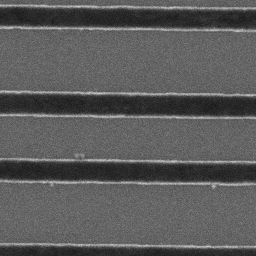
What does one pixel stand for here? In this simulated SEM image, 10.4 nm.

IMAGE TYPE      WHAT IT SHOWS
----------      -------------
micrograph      lines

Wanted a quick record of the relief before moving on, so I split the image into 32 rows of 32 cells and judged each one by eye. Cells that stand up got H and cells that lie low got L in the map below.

LLLLLLLLLLLLLLLLLLLLLLLLLLLLLLLL
HHHHHHHHHHHHHHHHHHHHHHHHHHHHHHHH
HHHHHHHHHHHHHHHHHHHHHHHHHHHHHHHH
LLLHHHHHHHHHHHHHHHHHHHHHHHHHHHHH
LLLLLLLLLLLLLLLLLLLLLLLLLLLLLLLL
LLLLLLLLLLLLLLLLLLLLLLLLLLLLLLLL
LLLLLLLLLLLLLLLLLLLLLLLLLLLLLLLL
LLLLLLLLLLLLLLLLLLLLLLLLLLLLLLLL
LLLLLLLLLLLLLLLLLLLLLLLLLLLLLLLL
LLLLLLLLLLLLLLLLLLLLLLLLLLLLLLLL
LLLLLLLLLLLLLLLLLLLLLLLLLLLLLLLL
LLLLLLLLLLLLLLLLLLLLLLLLLLLLLLLL
HHHHHHHHHHHHHHHHHHHHHHHHHHHHHHHH
HHHHHHHHHHHHHHHHHHHHHHHHHHHHHHHH
LLLLLLHHHHHHHHHHHHHHHHHHHHHHHHHH
LLLLLLLLLLLLLLLLLLLLLLLLLLLLLLLL
LLLLLLLLLLLLLLLLLLLLLLLLLLLLLLLL
LLLLLLLLLLLLLLLLLLLLLLLLLLLLLLLL
LLLLLLLLLLLLLLLLLLLLLLLLLLLLLLLL
LLLLLLLLLLLLLLLLLLLLLLLLLLLLLLLL
HHHHHHHHHHHHHHHHHHHHHHHHHHHHHHHH
HHHHHHHHHHHHHHHHHHHHHHHHHHHHHHHH
HHHHHHHHHHHHHHHHHHHHHHHHHHHHHHHH
LLLLLLLLLLLLLLLLLLLLLLLLLLLLLLLL
LLLLLLLLLLLLLLLLLLLLLLLLLLLLLLLL
LLLLLLLLLLLLLLLLLLLLLLLLLLLLLLLL
LLLLLLLLLLLLLLLLLLLLLLLLLLLLLLLL
LLLLLLLLLLLLLLLLLLLLLLLLLLLLLLLL
LLLLLLLLLLLLLLLLLLLLLLLLLLLLLLLL
LLLLLLLLLLLLLLLLLLLLLLLLLLLLLLLL
LLLLLLLLLLLLLLLLLLLLLLLLLLLLLLLL
HHHHHHHHHHHHHHHHHHHHHHHHHHHHHHHH